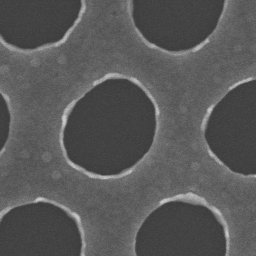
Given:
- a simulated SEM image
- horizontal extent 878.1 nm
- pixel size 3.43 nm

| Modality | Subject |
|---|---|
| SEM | holes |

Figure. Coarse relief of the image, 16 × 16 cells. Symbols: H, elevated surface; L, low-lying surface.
LLLLLHHHLLLLLLHH
LLLLLHHHLLLLLLHH
LLLLHHHHHLLLLHHH
HHHHHHHHHHHHHHHH
HHHHHHHHHHHHHHHH
HHHHHHLLLHHHHHHL
HHHHHLLLLLHHHHLL
LHHHLLLLLLHHHLLL
HHHHLLLLLLHHHLLL
HHHHLLLLLHHHHLLL
HHHHHLLLHHHHHHLL
HHHHHHHHHHHHHHHH
HHHHHHHHHHHHHHHH
LLLLHHHHHLLLLLHH
LLLLLHHHHLLLLLHH
LLLLLHHHLLLLLLHH